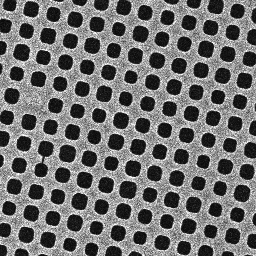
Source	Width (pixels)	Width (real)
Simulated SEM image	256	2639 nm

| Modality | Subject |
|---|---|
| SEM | a regular array of holes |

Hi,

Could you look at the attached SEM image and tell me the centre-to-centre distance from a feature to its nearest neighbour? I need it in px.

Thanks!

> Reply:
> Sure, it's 22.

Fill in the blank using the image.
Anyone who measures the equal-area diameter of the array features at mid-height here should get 163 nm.